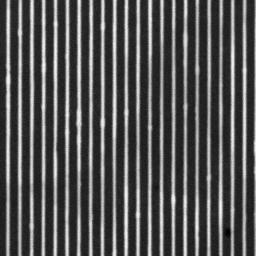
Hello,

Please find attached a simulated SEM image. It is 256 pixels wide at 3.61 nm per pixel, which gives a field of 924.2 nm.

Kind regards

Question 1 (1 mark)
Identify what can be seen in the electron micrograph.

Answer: parallel lines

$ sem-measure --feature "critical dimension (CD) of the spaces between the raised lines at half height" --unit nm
32.9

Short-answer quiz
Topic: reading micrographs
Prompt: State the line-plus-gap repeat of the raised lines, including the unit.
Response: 42.6 nanometers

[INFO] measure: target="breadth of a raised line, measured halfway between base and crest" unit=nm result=9.5